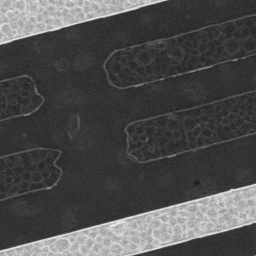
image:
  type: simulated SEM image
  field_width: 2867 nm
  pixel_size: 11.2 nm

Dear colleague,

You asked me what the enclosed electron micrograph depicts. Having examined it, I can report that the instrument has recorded one or a few lines or trenches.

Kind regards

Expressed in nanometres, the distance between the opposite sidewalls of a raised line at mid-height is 420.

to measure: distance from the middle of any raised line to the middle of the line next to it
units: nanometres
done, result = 888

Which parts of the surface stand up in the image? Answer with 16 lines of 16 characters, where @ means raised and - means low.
@@@@@@@@--------
@@@@@---------@@
@---------@@@@@@
-------@@@@@@@@@
-------@@@@@----
@@--------------
@@-----------@@@
---------@@@@@@@
--------@@@@@@@-
--@-----@@@-----
@@@@------------
@@@-------------
------------@@@@
---------@@@@@@@
-----@@@@@@@@@--
-@@@@@@@@@------